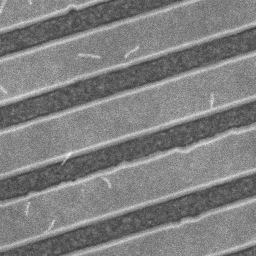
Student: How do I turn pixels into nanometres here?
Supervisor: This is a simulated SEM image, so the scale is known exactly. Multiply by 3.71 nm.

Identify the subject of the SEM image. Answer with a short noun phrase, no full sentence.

one or a few lines or trenches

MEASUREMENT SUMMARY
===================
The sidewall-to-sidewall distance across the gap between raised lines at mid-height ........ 94.9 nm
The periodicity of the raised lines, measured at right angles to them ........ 258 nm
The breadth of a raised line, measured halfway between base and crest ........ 164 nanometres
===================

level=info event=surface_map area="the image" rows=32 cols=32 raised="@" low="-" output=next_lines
@@@@@@@@@@@-----------@@@@@@@@@@
@@@@@@@@-----------@@@@@@@@@@@@@
@@@@@-----------@@@@@@@@@@@@@@@@
@@----------@@@@@@@@@@@@@@@@@@@-
---------@@@@@@@@@@@@@@@@@@@----
------@@@@@@@@@@@@@@@@@@@-------
---@@@@@@@@@@@@@@@@@@-----------
@@@@@@@@@@@@@@@@@@----------@@@@
@@@@@@@@@@@@@@@----------@@@@@@@
@@@@@@@@@@@-----------@@@@@@@@@@
@@@@@@@@@----------@@@@@@@@@@@@@
@@@@@-----------@@@@@@@@@@@@@@@@
@@-----------@@@@@@@@@@@@@@@@@@-
---------@@@@@@@@@@@@@@@@@@@----
------@@@@@@@@@@@@@@@@@@@-------
---@@@@@@@@@@@@@@@@@@@----------
@@@@@@@@@@@@@@@@@@@----------@@@
@@@@@@@@@@@@@@@-----------@@@@@@
@@@@@@@@@@@@-----------@@@@@@@@@
@@@@@@@@@----------@@@@@@@@@@@@@
@@@@@@----------@@@@@@@@@@@@@@@@
@@-----------@@@@@@@@@@@@@@@@@@@
----------@@@@@@@@@@@@@@@@@@@---
------@@@@@@@@@@@@@@@@@@@-------
---@@@@@@@@@@@@@@@@@@@----------
@@@@@@@@@@@@@@@@@@@----------@@@
@@@@@@@@@@@@@@@@----------@@@@@@
@@@@@@@@@@@@-----------@@@@@@@@@
@@@@@@@@@-----------@@@@@@@@@@@@
@@@@@@----------@@@@@@@@@@@@@@@@
@@@----------@@@@@@@@@@@@@@@@@@@
----------@@@@@@@@@@@@@@@@@@@---